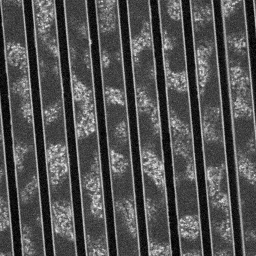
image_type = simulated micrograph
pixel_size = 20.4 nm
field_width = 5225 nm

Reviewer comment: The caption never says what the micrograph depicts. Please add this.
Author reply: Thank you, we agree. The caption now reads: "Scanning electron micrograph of parallel lines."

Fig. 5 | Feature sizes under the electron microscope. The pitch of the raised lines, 642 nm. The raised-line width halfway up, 0.458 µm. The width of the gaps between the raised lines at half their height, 0.18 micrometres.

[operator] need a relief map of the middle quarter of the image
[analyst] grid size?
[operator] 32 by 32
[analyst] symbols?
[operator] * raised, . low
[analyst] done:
..*****..******..******..******.
..*****..******..******..******.
..*****...*****..******..******.
..*****...*****...*****..******.
..*****...*****...*****..******.
..*****...*****...*****...*****.
..******..*****...*****...*****.
..******..*****...*****...*****.
..******..******..*****...*****.
..******..******..******..*****.
..******..******..******..*****.
...*****..******..******..******
...*****..******..******..******
...*****...*****..******..******
...*****...*****..******..******
...*****...*****...*****..******
...*****...*****...*****...*****
...******..*****...*****...*****
*..******..*****...*****...*****
*..******..*****...*****...*****
*..******..*****...*****...*****
*..******..*****...******..*****
*..******..******..******..*****
*...*****..******..******..*****
*...*****...*****..******..*****
*...*****...*****..******..*****
*...*****...*****...*****..*****
*...*****...*****...*****..*****
*...*****...*****...*****...****
*...*****...*****...*****...****
**..*****...*****...*****...****
**..******..******..*****...****